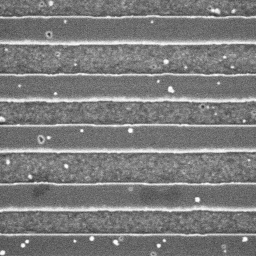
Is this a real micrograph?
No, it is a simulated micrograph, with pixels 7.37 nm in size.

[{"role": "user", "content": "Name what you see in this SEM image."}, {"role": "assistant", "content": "lines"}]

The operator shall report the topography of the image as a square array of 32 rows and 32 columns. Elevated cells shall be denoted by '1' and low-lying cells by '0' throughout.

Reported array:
00000000000000000000000000000000
00000000000000000000000000000000
11111111111111111111111111111111
11111111111111111111111111111111
11111111111111111111111111111111
00000000000000000000000000000000
00000000000000000000000000000000
00000000000000000000000000000000
00000000000000000000000000000000
11111111111111111111111111111111
11111111111111111111111111111111
11111111111111111111111111111111
11111111111110111111111111111111
00000000000000000000000000000000
00000000000000000000000000000000
00000000000000000000000000000000
11111111111111111111111111111111
11111111111111111111111111111111
11111111111111111111111111111111
00000000000000000000000000000000
00000000000000000000000000000000
00000000000000000000000000000000
00000000000000000000000000000000
11111111111111111111111111111111
11111111111111111111111111111111
11111111111111111111111111111111
00000000000000000000000000000000
00000000000000000000000000000000
00000000000000000000000000000000
11111111111111111111111111111111
11111111111111111111111111111111
11111111111111111111111111111111